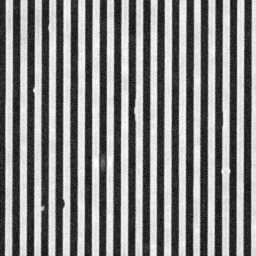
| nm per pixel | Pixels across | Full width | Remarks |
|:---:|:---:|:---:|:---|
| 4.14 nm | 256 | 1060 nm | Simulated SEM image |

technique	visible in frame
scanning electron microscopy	parallel lines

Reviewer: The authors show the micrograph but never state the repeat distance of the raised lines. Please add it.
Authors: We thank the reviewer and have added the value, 60 nm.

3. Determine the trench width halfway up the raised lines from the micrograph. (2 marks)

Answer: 35.2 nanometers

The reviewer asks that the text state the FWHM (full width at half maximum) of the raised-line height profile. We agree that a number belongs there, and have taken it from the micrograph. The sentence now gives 0.0249 microns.